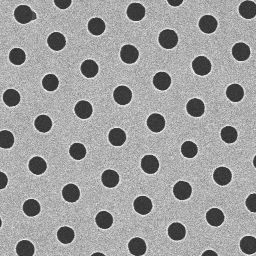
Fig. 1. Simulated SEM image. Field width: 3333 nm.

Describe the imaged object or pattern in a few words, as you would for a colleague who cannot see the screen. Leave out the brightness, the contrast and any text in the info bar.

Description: a regular array of holes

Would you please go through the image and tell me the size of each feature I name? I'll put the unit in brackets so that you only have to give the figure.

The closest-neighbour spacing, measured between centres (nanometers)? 542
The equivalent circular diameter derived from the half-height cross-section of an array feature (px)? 18.6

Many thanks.